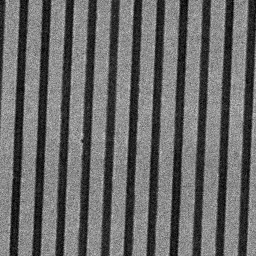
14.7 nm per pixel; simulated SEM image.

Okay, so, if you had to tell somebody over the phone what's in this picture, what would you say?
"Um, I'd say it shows parallel lines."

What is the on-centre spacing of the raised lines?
334 nanometers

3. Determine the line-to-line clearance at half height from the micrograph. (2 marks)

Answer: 119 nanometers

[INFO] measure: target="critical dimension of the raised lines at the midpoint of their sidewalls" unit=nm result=205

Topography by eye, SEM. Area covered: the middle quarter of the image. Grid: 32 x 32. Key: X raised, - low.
--XXX---XXX--XXXX--XXX---XXX---X
--XXX---XXX--XXXX--XXX---XXX---X
--XXX--XXXX--XXXX--XXX---XXX---X
--XXX--XXXX--XXXX--XXX---XXX--XX
--XXX--XXXX--XXXX--XXX---XXX--XX
--XXX--XXXX--XXXX--XXX---XXX--XX
--XXX--XXXX--XXXX--XXX---XXX--XX
--XXX--XXXX--XXXX--XXX---XXX--XX
--XXX--XXXX--XXXX--XXX---XXX--XX
--XXX--XXXX--XXX---XXX--XXXX--XX
-XXXX--XXXX--XXX---XXX--XXXX--XX
-XXXX--XXXX--XXX---XXX--XXXX--XX
--XXX--XXXX--XXX---XXX--XXXX--XX
--XXX--XXXX--XXX---XXX--XXXX--XX
-XXXX--XXXX--XXX---XXX--XXXX--XX
-XXXX--XXX---XXX--XXXX--XXXX--XX
-XXXX--XXX---XXX--XXXX--XXX---XX
-XXXX--XXX---XXX--XXXX--XXX---XX
-XXXX--XXX---XXX--XXXX--XXX---XX
-XXX---XXX---XXX--XXXX--XXX---XX
-XXXX--XXX---XXX--XXXX--XXX---XX
-XXX---XXX--XXXX--XXXX--XXX---XX
-XXX---XXX--XXXX--XXX---XXX---XX
-XXX---XXX--XXXX--XXX---XXX---XX
-XXX---XXX--XXXX--XXX---XXX---XX
-XXX---XXX--XXXX--XXX---XXX---XX
-XXX---XXX--XXXX--XXX---XXX---XX
-XXX--XXXX--XXXX--XXX---XXX--XXX
-XXX--XXXX--XXXX--XXX---XXX--XXX
-XXX--XXXX--XXXX--XXX---XXX--XXX
-XXX--XXXX--XXXX--XXX---XXX--XXX
-XXX--XXXX--XXXX--XXX---XXX--XXX